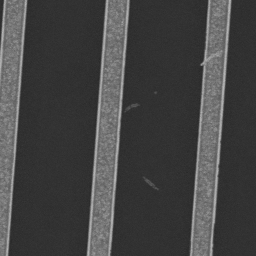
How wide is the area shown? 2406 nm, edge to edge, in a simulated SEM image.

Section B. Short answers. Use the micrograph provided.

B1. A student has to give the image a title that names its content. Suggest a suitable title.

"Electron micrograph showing one or a few lines or trenches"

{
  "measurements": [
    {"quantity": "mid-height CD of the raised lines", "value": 0.191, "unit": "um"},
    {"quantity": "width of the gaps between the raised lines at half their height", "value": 763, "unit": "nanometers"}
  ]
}